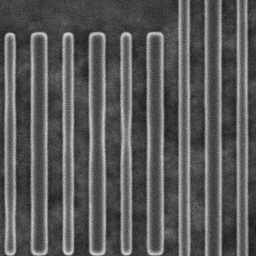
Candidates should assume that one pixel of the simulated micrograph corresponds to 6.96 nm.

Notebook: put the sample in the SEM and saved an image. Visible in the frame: groups of lines, slits or small figures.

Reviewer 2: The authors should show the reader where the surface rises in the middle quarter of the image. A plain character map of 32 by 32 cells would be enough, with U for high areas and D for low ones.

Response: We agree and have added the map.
UUDDDDUUUUDDDDUUUDDDDUUUUDDDDUUD
UUDDDDUUUUDDDDUUUDDDDUUUUDDDDUUD
UUDDDDUUUUDDDDUUUDDDDUUUUDDDDUUD
UUDDDDUUUUDDDDUUUDDDDUUUUDDDDUUD
UUDDDDUUUUDDDDUUUDDDDUUUUDDDDUUD
UUDDDDUUUUDDDDUUUDDDDUUUUDDDDUUD
UUDDDDUUUUDDDDUUUDDDDUUUUDDDDUUD
UUDDDDUUUUDDDDUUUDDDDUUUUDDDDUUD
UUDDDDUUUUDDDDUUUDDDDUUUUDDDDUUD
UUDDDDUUUUDDDDUUUDDDDUUUUDDDDUUD
UUDDDDDUUUDDDDUUUDDDDUUUUDDDDUUD
UUDDDDDUUUDDDDUUUDDDDUUUUDDDDUUD
UUDDDDDUUUDDDDDUUDDDDUUUUDDDDUUD
UUDDDDDUUUDDDDDUUDDDDUUUUDDDDUUD
UUDDDDDUUUDDDDDUUDDDDUUUUDDDDUUD
UUDDDDDUUUDDDDDUUDDDDUUUUDDDDUUD
UUDDDDDUUUDDDDDUUDDDDUUUUDDDDUUD
UUDDDDDUUUDDDDDUUDDDDUUUUDDDDUUD
UUDDDDDUUUDDDDDUUDDDDUUUUDDDDUUD
UUDDDDDUUUDDDDDUUDDDDUUUUDDDDUUD
UUDDDDDUUUDDDDDUUDDDDUUUUDDDDUUD
UUDDDDDUUUDDDDDUUDDDDUUUUDDDDUUD
UUDDDDDUUUDDDDUUUDDDDUUUUDDDDUUD
UUDDDDDUUUDDDDUUUDDDDUUUUDDDDUUD
UUDDDDDUUUDDDDUUUDDDDUUUUDDDDUUD
UUDDDDDUUUDDDDUUUDDDDUUUUDDDDUUD
UUDDDDDUUUDDDDUUUDDDDUUUUDDDDUUD
UUDDDDDUUUDDDDUUUDDDDUUUUDDDDUUD
UUDDDDDUUUDDDDUUUDDDDUUUUDDDDUUD
UUDDDDDUUUDDDDUUUDDDDUUUUDDDDUUD
UUDDDDDUUUDDDDUUUDDDDUUUUDDDDUUD
UUDDDDDUUUDDDDUUUDDDDUUUUDDDDUUD